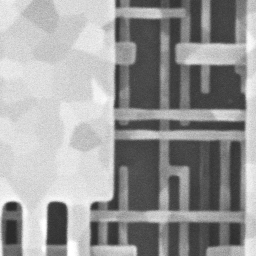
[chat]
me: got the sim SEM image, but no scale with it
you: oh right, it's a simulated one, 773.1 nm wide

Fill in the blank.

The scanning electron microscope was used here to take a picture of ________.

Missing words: wiring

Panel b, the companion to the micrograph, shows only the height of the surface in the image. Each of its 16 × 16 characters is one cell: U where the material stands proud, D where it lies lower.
UUUUUUUDDDDDDDDU
UUUUUUUDDDDDDDDU
UUUUUUUDDDDDDDDU
UUUUUUUDDDDDDDDU
UUUUUUUDDDDDDDDU
UUUUUUUDDDDDDDDU
UUUUUUUDDDDDDDDU
UUUUUUUDDDDDDDDU
UUUUUUUDDDDDDDDU
UUUUUUUDDDDDDDDU
UUUUUUUDDDDDDDDU
UUUUUUUDDDDDDDDU
UUUUUUUDDDDDDDDU
DUUDUUDDDDDDDDDU
DUUDUUDDDDDDDDDU
DUUDUUDDDDDDDDDU